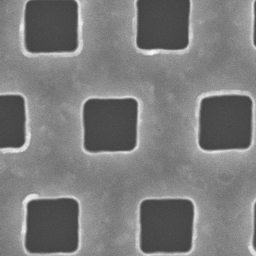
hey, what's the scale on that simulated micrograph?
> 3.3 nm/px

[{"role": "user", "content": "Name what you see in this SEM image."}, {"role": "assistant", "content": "holes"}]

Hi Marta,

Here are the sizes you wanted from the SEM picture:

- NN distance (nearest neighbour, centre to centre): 115 pixels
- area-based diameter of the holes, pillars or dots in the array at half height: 0.198 um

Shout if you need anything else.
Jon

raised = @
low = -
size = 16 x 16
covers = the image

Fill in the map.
@@---@@@@---@@@@
@@---@@@@---@@@@
@@---@@@@---@@@@
@@@@@@@@@@@@@@@@
@@@@@@@@@@@@@@@@
@@@@@@@@@@@@@@@@
--@@@----@@@@---
--@@@----@@@----
--@@@----@@@----
@@@@@@@@@@@@@@@@
@@@@@@@@@@@@@@@@
@@@@@@@@@@@@@@@@
@@---@@@@---@@@@
@@---@@@@---@@@@
@@---@@@@---@@@@
@@---@@@@---@@@@